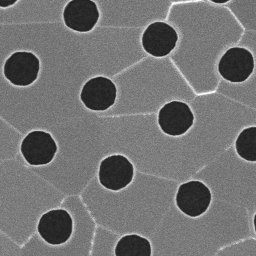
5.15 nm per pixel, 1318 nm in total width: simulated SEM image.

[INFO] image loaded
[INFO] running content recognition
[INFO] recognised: a regular array of holes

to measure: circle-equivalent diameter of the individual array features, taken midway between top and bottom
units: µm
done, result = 0.18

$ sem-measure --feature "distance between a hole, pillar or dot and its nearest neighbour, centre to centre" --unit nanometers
415